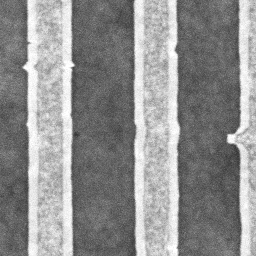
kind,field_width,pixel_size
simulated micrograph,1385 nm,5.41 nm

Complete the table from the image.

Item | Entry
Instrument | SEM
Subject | one or a few lines or trenches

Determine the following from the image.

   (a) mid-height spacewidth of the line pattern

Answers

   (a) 70.7 px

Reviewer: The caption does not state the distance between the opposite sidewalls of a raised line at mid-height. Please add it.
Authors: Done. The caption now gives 192 nm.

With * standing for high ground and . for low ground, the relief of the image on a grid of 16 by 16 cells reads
..**.....**....*
..**.....**....*
..**.....**....*
..**.....**....*
..**.....**....*
..**.....**....*
..**.....**....*
..**.....**....*
..**.....**....*
..**.....**....*
..**.....**....*
..**.....**....*
..**.....**....*
..**.....**....*
..**.....**....*
..**.....**....*